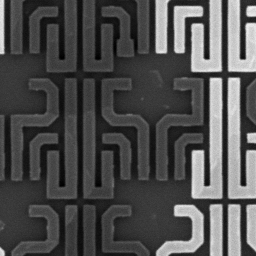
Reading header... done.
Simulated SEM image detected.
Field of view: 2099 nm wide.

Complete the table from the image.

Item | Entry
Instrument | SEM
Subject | wiring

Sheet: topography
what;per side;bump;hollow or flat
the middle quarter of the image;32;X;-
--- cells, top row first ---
XXX--XXXXXXX--------------------
XXX--XXXXXXX--------------------
--------------------------------
--------------------------------
XXX--XXX--XXXXXXX-----------XXXX
XXX--XXX--XXXXXXX-----------XXXX
XXX--XXX--XXX-------------------
XXX--XXX--XX--------------------
XXX--XXX--XX--------------------
XXX--XXX--XX--------------------
XXX--XXX--XX--------------------
XXX--XXX--XX--------------------
XXX--XXX--XXX-------------------
XXX--XXX--XXXXXXXXX------XXXXXXX
XXX--XXX---XXXXXXXXX----XXXXXXXX
XXX--XXX----------XXX--XXX------
XXX--XXX----------XXX--XXX------
XXX--XXX--XXXXX----XX--XXX----XX
XXX--XXX--XXXXXX---XX--XXX---XXX
XXX--XXX--XXXXXXX--XX--XXX--XXXX
XXX--XXX------XXX--XX--XXX--XX--
XXX--XXX------XXX--XX--XXX--XX--
XXX--XXX--XX--XXX--XX--XXX--XX--
XXX--XXX--XX--XXX--XX--XXX--XX--
XXX--XXX--XX--XXX--XX--XXX--XX--
XXX--XXX--XX--XXX--XX--XXX--XX--
XXX--XXX--XX--XXX--XX--XXX--XX--
-XX--XXX--XX--XXX--XX--XXX--XX--
-XX--XXX--XX--XXX--XX--XXX--XX--
-XX--XXX--XX--------------------
XXX--XXX-XXX--------------------
XXX--XXXXXXX--------------------